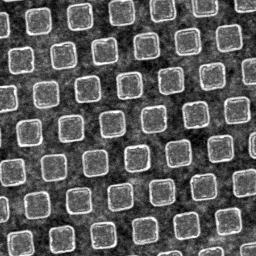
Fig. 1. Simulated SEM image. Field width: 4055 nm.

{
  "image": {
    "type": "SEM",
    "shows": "a regular array of raised bodies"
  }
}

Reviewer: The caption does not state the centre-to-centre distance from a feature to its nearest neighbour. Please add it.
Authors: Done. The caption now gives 661 nanometres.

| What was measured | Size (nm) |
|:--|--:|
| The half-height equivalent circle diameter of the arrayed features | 434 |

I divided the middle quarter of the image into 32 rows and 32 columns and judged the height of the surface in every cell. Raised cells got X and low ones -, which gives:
XXX-----------------------------
-------------------------XXXXX--
----------------XXX-----XXXXXX--
----XXXX-----XXXXXX-----XXXXXX--
---XXXXXX----XXXXXX-----XXXXXX--
---XXXXXX-----XXXXX-----XXXXXX--
---XXXXXX----XXXXXX-----XXXXXX--
---XXXXXX-----XXXXX-------------
---XXXXXX-----XX----------------
----X---------------------------
------------------------------XX
--------------------XXXXX-----XX
----------XXXXX----XXXXXX-----XX
XXXX-----XXXXXX-----XXXXX-----XX
XXXXX----XXXXXX-----XXXXX-----XX
XXXXX----XXXXXX-----XXXXX-----XX
XXXXX----XXXXXX-----XXXXX-------
XXXXX-----XXXXX-----------------
XXXXX---------------------------
---------------------------XXXX-
-------------------X------XXXXX-
---------X-----XXXXXX-----XXXXX-
-----XXXXXX----XXXXXX-----XXXXXX
-----XXXXXX----XXXXXX-----XXXXXX
-----XXXXXX----XXXXXX-----XXXXXX
-----XXXXXX-----XXXXX------XX---
X----XXXXXX-----XXXX------------
X----XXXXX----------------------
--------------------------------
----------------------XXXXX-----
------------XXXXX-----XXXXXX----
-XXXXX-----XXXXXX----XXXXXX-----